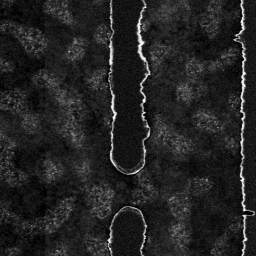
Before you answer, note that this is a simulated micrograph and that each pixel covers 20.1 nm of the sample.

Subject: one or a few lines or trenches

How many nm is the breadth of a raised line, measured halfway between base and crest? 639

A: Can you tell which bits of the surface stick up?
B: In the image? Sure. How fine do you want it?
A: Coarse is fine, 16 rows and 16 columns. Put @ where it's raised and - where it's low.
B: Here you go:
-------@@------@
-------@@------@
-------@@------@
-------@@------@
-------@@------@
-------@@------@
-------@@------@
-------@@------@
-------@@------@
-------@@------@
-------@@------@
---------------@
---------------@
-------@@------@
-------@@------@
-------@@------@